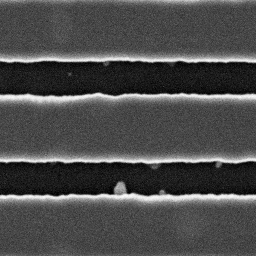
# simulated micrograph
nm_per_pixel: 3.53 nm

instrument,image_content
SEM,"lines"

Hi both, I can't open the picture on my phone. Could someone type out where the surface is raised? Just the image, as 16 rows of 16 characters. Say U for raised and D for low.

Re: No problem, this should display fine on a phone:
UUUUUUUUUUUUUUUU
UUUUUUUUUUUUUUUU
UUUUUUUUUUUUUUUU
UUUUUUUUUUUUUUUU
DDDDDDDDDDDDDDDD
DDDDDDDDDDDDDDDD
UUUUUUUUUUUUUUUU
UUUUUUUUUUUUUUUU
UUUUUUUUUUUUUUUU
UUUUUUUUUUUUUUUU
DDDDDDDDDDDDDDDD
DDDDDDDDDDDDDDDD
UUUUUUUUUUUUUUUU
UUUUUUUUUUUUUUUU
UUUUUUUUUUUUUUUU
UUUUUUUUUUUUUUUU